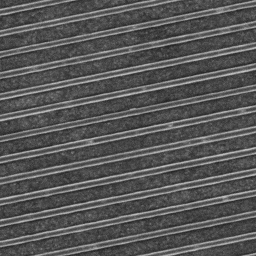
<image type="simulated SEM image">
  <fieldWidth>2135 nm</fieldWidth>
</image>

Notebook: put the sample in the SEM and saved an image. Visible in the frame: parallel lines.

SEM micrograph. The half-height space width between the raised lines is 124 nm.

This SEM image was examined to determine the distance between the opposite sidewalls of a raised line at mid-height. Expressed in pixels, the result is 6.13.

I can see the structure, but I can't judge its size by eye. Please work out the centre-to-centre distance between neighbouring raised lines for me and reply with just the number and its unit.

172 nm